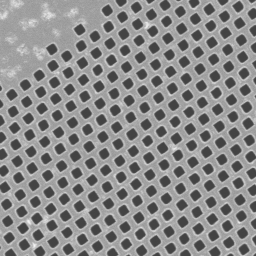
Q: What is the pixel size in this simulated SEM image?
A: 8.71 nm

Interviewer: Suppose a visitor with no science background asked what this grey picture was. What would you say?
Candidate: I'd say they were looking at a regular array of holes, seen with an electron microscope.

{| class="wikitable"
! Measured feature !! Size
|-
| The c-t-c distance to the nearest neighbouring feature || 16.6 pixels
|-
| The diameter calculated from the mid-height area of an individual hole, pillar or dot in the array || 92.2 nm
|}